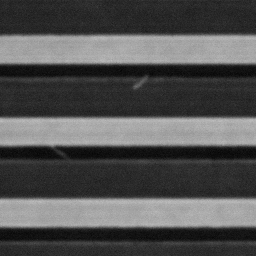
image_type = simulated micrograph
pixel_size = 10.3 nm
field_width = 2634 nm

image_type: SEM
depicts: lines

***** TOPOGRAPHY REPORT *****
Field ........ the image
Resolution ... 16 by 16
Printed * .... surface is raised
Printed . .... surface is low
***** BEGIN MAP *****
................
................
****************
****************
................
................
................
****************
****************
................
................
................
****************
****************
................
................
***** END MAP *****